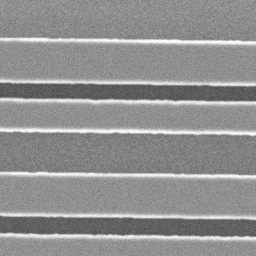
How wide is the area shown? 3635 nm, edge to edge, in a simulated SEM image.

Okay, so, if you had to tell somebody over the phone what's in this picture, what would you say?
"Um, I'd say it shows lines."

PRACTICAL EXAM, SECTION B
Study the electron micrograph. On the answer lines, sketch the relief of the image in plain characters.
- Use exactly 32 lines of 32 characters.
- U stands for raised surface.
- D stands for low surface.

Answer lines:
DDDDDDDDDDDDDDDDDDDDDDDDDDDDDDDD
DDDDDDDDDDDDDDDDDDDDDDDDDDDDDDDD
DDDDDDDDDDDDDDDDDDDDDDDDDDDDDDDD
DDDDDDDDDDDDDDDDDDDDDDDDDDDDDDDD
DDDDDDDDDDDDDDDDDDDDDDDDDDDDDDDD
UUUUUUUUUUUUUUUUUUUUUUUUUUUUUUUU
UUUUUUUUUUUUUUUUUUUUUUUUUUUUUUUU
UUUUUUUUUUUUUUUUUUUUUUUUUUUUUUUU
UUUUUUUUUUUUUUUUUUUUUUUUUUUUUUUU
UUUUUUUUUUUUUUUUUUUUUUUUUUUUUUUU
DDDDDDDDDDDDDDDDDDDUUUUUUUUUUUUU
DDDDDDDDDDDDDDDDDDDDDDDDDDDDDDDD
UUUUUUUUUUUDDUDDDDDDDDDDDDDDDDDD
UUUUUUUUUUUUUUUUUUUUUUUUUUUUUUUU
UUUUUUUUUUUUUUUUUUUUUUUUUUUUUUUU
UUUUUUUUUUUUUUUUUUUUUUUUUUUUUUUU
DDDDDDDDDDUDUUDUUUUUUUUUUUUUUUUU
DDDDDDDDDDDDDDDDDDDDDDDDDDDDDDDD
DDDDDDDDDDDDDDDDDDDDDDDDDDDDDDDD
DDDDDDDDDDDDDDDDDDDDDDDDDDDDDDDD
DDDDDDDDDDDDDDDDDDDDDDDDDDDDDDDD
DDDDDDDDDDDDDDDDDDDDDDDDDDDDDDDD
UUUUUUUUUUUUUUUUUUUUUUUUUUUUUUUU
UUUUUUUUUUUUUUUUUUUUUUUUUUUUUUUU
UUUUUUUUUUUUUUUUUUUUUUUUUUUUUUUU
UUUUUUUUUUUUUUUUUUUUUUUUUUUUUUUU
UUUUUUUUUUUUUUUUUUUUUUUUUUUUUUUU
DDDDDDDDDDDDDDDDDDDDDDDDDDDDDDDD
DDDDDDDDDDDDDDDDDDDDDDDDDDDDDDDD
UUUUUUUUUUUUUUDDDDDDDDDDDDDDDDDD
UUUUUUUUUUUUUUUUUUUUUUUUUUUUUUUU
UUUUUUUUUUUUUUUUUUUUUUUUUUUUUUUU